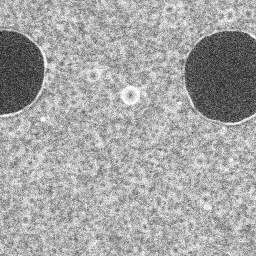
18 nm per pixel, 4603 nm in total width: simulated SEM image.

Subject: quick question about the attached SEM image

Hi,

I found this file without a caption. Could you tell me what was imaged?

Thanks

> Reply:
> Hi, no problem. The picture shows holes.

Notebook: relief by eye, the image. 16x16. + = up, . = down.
++++++++++++++++
++++++++++++++++
..+++++++++++...
...+++++++++....
...+++++++++....
...+++++++++....
..++++++++++....
+++++++++++++..+
++++++++++++++++
++++++++++++++++
++++++++++++++++
++++++++++++++++
++++++++++++++++
++++++++++++++++
++++++++++++++++
++++++++++++++++